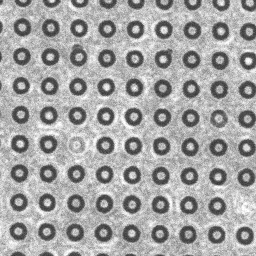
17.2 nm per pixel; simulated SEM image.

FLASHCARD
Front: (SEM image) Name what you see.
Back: a regular array of ring-shaped grooves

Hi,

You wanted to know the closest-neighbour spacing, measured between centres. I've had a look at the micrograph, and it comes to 28.2 pixels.